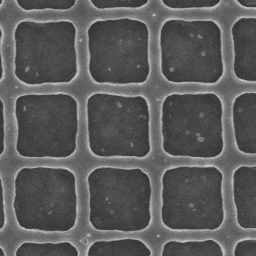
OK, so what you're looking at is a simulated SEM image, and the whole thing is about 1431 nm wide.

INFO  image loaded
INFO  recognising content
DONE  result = a regular array of holes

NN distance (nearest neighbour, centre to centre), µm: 0.407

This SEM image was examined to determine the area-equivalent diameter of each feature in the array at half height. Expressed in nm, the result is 383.